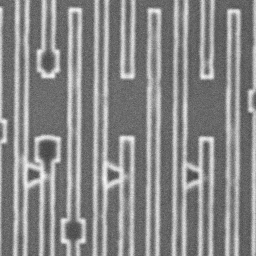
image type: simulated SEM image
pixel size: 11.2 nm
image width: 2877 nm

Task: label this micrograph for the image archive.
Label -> wiring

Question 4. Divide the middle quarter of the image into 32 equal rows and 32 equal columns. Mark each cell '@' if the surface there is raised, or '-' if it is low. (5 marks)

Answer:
-@@@----@@-----@@----@@@----@@--
-@@@----@@-----@@----@@@----@@--
-@@@----@@-----@@----@@@----@@--
-@@@----@@-----------@@@----@@--
-@@@----@@------------@@----@@--
-@@@----@@------------@@----@@--
-@@@----@@-----------@@@----@@--
-@@@----@@-----------@@@----@@--
-@@@----@@-----------@@@----@@--
-@@@----@@-----------@@@----@@--
-@@@----@@-----------@@@----@@--
-@@@----@@-----------@@@----@@--
-@@@----@@-----------@@@----@@--
-@@@----@@-----------@@@----@@--
-@@@----@@-----------@@@----@@--
-@@@----@@-----------@@@----@@--
-@@@----@@-----------@@@----@@--
-@@@----@@-----------@@@----@@--
-@@@----@@----@@@----@@@----@@--
-@@@----@@----@@@----@@@----@@--
-@@@----@@----@@@----@@@----@@--
-@@@----@@----@@@----@@@----@@--
-@@@----@@----@@@----@@@----@@--
-@@@----@@----@@@----@@@----@@--
-@@@----@@----@@@----@@@----@@--
-@@@----@@----@@@----@@@----@@--
-@@@----@@----@@@----@@@----@@--
-@@@----@@-----@@----@@@----@@--
-@@@----@@-----@@----@@@----@@--
-@@@----@@----@@@----@@@----@@--
-@@@----@@----@@@----@@@----@@--
-@@@----@@----@@@----@@@----@@--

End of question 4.